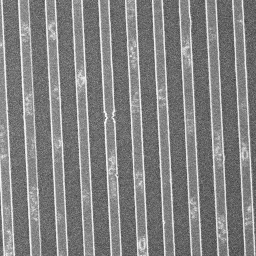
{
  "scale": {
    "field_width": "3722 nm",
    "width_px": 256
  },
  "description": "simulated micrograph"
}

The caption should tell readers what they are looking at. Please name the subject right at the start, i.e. parallel lines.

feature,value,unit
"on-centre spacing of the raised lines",388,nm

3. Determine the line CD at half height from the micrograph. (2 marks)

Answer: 0.147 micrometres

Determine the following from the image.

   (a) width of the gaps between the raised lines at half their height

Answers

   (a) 238 nm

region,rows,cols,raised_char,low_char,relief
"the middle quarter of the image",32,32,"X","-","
---XX-----XX----XXX----XX-----XX
---XX-----XX----XXX----XX-----XX
---XX-----XX----XXX----XX-----XX
---XX-----XX----XXX----XX-----XX
---XX-----XX-----XX----XX-----XX
---XX-----XX-----XX----XX-----XX
---XXX----XX-----XX----XXX----XX
---XXX----XX-----XX----XXX----XX
---XXX----XX-----XX----XXX----XX
---XXX----XX-----XX----XXX----XX
---XXX----XX-----XX----XXX----XX
---XXX----XX-----XX----XXX----XX
----XX----XX-----XX-----XX----XX
----XX----XX-----XX-----XX----XX
----XX----XXX----XX-----XX----XX
----XX----XXX----XX-----XX----XX
----XX----XXX----XX-----XX-----X
----XX----XXX----XX-----XX-----X
----XX----XXX----XXX----XX-----X
----XX----XXX----XXX----XX-----X
----XX-----XX----XXX----XX-----X
----XX-----XX----XXX----XX-----X
----XX-----XX----XXX----XX-----X
----XX-----XX----XXX----XX-----X
----XX-----XX-----XX----XX-----X
----XX-----XX-----XX----XX-----X
----XXX----XX-----XX----XXX----X
----XXX----XX-----XX----XXX----X
----XXX----XX-----XX----XXX----X
----XXX----XX-----XX----XXX----X
----XXX----XX-----XX----XXX----X
----XXX----XX-----XX----XXX----X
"